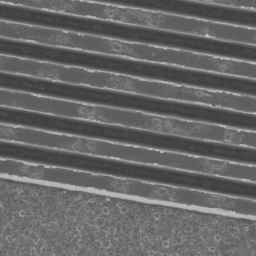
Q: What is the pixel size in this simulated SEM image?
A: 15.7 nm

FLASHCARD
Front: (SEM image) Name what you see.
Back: parallel lines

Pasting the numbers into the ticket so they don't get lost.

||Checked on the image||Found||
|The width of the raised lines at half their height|325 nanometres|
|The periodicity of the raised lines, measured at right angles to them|534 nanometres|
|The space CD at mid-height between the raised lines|12.9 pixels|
